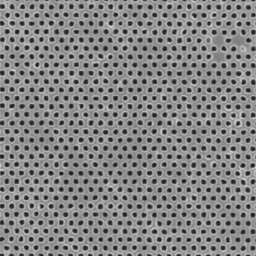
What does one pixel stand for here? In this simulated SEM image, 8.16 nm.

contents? a regular array of holes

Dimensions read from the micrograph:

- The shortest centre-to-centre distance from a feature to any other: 0.0755 um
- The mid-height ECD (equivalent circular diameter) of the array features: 40.2 nanometres